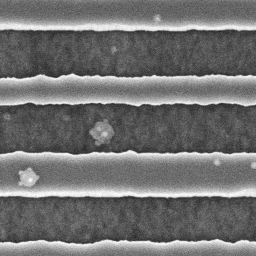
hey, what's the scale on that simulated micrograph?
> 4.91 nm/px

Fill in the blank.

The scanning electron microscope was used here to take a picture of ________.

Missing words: lines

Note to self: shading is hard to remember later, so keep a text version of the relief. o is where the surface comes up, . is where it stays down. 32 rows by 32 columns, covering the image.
oooooooooooooooooooooooooooooooo
oooooooooooooooooooooooooooooooo
oooooooooooooooooooooooooooooooo
...ooooooooooooooooooooooooooooo
................................
................................
................................
................................
................................
.....o..oo.........o......oo...o
oooooooooooooooooooooooooooooooo
oooooooooooooooooooooooooooooooo
oooooooooooooooooooooooooooooooo
................................
................................
................................
................................
................................
................................
oooooooooooooooooooooooooooooooo
oooooooooooooooooooooooooooooooo
oooooooooooooooooooooooooooooooo
oooooooooooooooooooooooooooooooo
oooooooooooooooooooooooooooooooo
.................o..ooo.....o...
................................
................................
................................
................................
................................
oooooooooo.ooooooooooooooooooooo
oooooooooooooooooooooooooooooooo